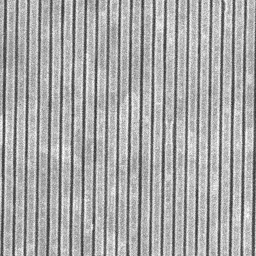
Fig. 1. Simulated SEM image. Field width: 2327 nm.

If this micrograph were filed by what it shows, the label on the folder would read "parallel lines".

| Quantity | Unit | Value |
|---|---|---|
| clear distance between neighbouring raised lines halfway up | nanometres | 34.1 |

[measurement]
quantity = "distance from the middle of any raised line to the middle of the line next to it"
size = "0.104 um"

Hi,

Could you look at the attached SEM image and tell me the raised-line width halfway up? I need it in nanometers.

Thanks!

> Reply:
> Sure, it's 68.2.